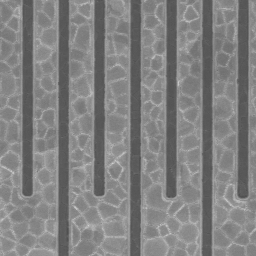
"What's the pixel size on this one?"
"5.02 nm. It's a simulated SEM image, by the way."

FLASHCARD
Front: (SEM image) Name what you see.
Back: parallel lines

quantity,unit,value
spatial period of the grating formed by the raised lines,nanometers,181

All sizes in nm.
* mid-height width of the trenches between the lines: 61.4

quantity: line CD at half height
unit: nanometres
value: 120